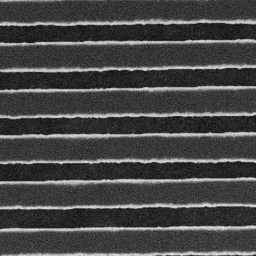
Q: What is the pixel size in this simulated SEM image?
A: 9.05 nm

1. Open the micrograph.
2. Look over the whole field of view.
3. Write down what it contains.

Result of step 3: lines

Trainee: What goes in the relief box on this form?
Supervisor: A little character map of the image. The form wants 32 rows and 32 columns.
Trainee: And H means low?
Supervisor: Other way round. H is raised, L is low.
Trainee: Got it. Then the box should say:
HHHHHHHHHHHHHHHHHHHHHHHHHHHHHHHH
HHHHHHHHHHHHHHHHHHHHHHHHHHHHHHHH
HHHHHHHHHHHHHHHHHHHHHHHHHHHHHHHH
LLLLLLLLLLLLLLLLLLLLLLLLLLLLLLLL
LLLLLLLLLLLLLLLLLLLLLLLLLLLLLLLL
HHHHHHHHHHHHHHHHHHHHHHHHHHHHHHHH
HHHHHHHHHHHHHHHHHHHHHHHHHHHHHHHH
HHHHHHHHHHHHHHHHHHHHHHHHHHHHHHHH
HHHHHHHHHHHHHHHHHHHHHHHHHHHLLLLL
LLLLLLLLLLLLLLLLLLLLLLLLLLLLLLLL
LLLLLLLLLLLLLLLLLLLLLLLLLLLLLLLL
HHHHHHHHHHHHHHHHHHHHHHHHHHHHHHHH
HHHHHHHHHHHHHHHHHHHHHHHHHHHHHHHH
HHHHHHHHHHHHHHHHHHHHHHHHHHHHHHHH
HHHHHHHHHHHHHHHLLLLHHLLLLLLLLLLL
LLLLLLLLLLLLLLLLLLLLLLLLLLLLLLLL
LLLLLLLLLLLLLLLLLLLLLLLLLLLLLLLL
HHHHHHHHHHHHHHHHHHHHHHHHHHHHHHHH
HHHHHHHHHHHHHHHHHHHHHHHHHHHHHHHH
HHHHHHHHHHHHHHHHHHHHHHHHHHHHHHHH
LLLLLLLLLLLLLLLLLLLLLLLLLLLLLLLL
LLLLLLLLLLLLLLLLLLLLLLLLLLLLLLLL
LLLLLLLLLLLLLLLLLLLLLLLLLHHHHHHH
HHHHHHHHHHHHHHHHHHHHHHHHHHHHHHHH
HHHHHHHHHHHHHHHHHHHHHHHHHHHHHHHH
HHHHHHHHHHHHHHHHHHHHHHHHHHHHHHHH
LLLLLLLLLLLLLLLLLLLLLLLLLLLLLLLL
LLLLLLLLLLLLLLLLLLLLLLLLLLLLLLLL
LLLLLLLLLLLLLLLLLLLLLLLHLHLLHHHH
HHHHHHHHHHHHHHHHHHHHHHHHHHHHHHHH
HHHHHHHHHHHHHHHHHHHHHHHHHHHHHHHH
HHHHHHHHHHHHHHHHHHHHHHHHHHHHHHHH